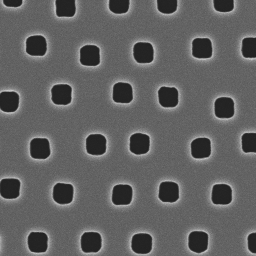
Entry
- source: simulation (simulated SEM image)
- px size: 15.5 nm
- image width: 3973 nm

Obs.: a regular array of holes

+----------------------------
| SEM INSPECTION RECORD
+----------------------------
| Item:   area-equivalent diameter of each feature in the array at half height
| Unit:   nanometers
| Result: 335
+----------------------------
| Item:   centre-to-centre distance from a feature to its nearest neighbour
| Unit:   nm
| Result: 748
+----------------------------